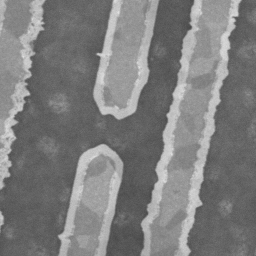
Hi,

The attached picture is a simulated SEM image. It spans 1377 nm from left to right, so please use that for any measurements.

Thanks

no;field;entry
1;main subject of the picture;one or a few lines or trenches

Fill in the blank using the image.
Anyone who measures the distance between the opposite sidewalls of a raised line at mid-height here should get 37.9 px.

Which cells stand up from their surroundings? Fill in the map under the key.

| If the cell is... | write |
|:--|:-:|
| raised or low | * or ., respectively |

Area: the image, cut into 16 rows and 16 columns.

**.....***..***.
**.....**...**..
**.....**...**..
**.....**...**..
**....***...**..
*.....***..***..
*.....**...**...
*..........**...
*.........***...
*.....*...***...
.....**...***...
.....**...**....
.....**...**....
....***..***....
....***..***....
....**...**.....